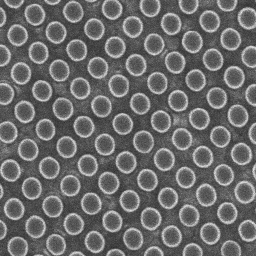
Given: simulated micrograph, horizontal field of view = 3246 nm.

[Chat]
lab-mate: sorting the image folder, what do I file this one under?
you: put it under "a regular array of raised bodies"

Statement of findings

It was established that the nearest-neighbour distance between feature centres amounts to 340 nanometers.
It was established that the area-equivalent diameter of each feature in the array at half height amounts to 256 nm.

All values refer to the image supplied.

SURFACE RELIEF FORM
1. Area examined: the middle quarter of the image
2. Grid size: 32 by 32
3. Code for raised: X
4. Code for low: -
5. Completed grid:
X-----XXXXX-----XXXX------XXXX--
X-----XXXXX-----XXXX------XXXX--
X------XXXX------XX---XX-------X
X-----------XXX------XXXX------X
--XXXX-----XXXXX-----XXXXX-----X
--XXXX-----XXXXX-----XXXXX-----X
--XXXX------XXXX------XXX-------
--XXXX------XXX---X--------XXX--
---XX---XXX------XXXX-----XXXXX-
XX-----XXXX------XXXX-----XXXXX-
XX-----XXXXX-----XXXX------XXXX-
XX-----XXXXX-----XXXX-------XX--
XX------XXX---X--------XXX------
X---XX-------XXX------XXXX-----X
---XXXX-----XXXXX-----XXXXX-----
---XXXX-----XXXXX-----XXXXX-----
---XXXX------XXXX------XXX--XXX-
---XXXX-----------XXX------XXXX-
XX------XXXX------XXXX-----XXXXX
XXX-----XXXX-----XXXXX-----XXXXX
XXX-----XXXXX-----XXXX------XXX-
XXX-----XXXX------XXXX--XX------
XX-------XX---XXX------XXXX-----
----XXXX-----XXXXX-----XXXX-----
----XXXX-----XXXXX-----XXXX-----
----XXXX-----XXXXX-----XXXX-----
----XXXX------XXX-------XX---XXX
-----XX---XX-------XXXX-----XXXX
XXX------XXXX------XXXX-----XXXX
XXXX-----XXXXX-----XXXX-----XXXX
XXXX-----XXXXX-----XXXX------XXX
XXXX-----XXXX-------XX---XX-----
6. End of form